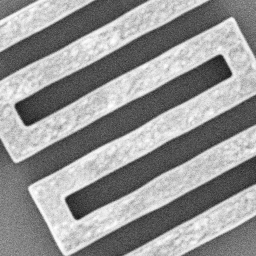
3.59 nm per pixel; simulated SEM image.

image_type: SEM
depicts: groups of lines, slits or small figures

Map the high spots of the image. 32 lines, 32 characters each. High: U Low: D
DDDDUUUUUUUDDDDDDDUUUUUUUDDDDDDD
DDUUUUUUUDDDDDDDUUUUUUUDDDDDDDDD
UUUUUUUDDDDDDDDUUUUUUDDDDDDDUDDD
UUUUUDDDDDDDDUUUUUUDDDDDDDDUUUDD
UUUDDDDDDDDUUUUUUDDDDDDDDUUUUUDD
UUDDDDDDDUUUUUUUDDDDDDDUUUUUUUUD
DDDDDDDUUUUUUUDDDDDDDUUUUUUUUUUD
DDDDDUUUUUUUDDDDDDDUUUUUUUDDUUUU
DDDUUUUUUUDDDDDDDUUUUUUUDDDDDUUU
DUUUUUUUDDDDDDDUUUUUUUDDDDDDDUUU
UUUUUUDDDDDDDUUUUUUUDDDDDDDUUUUU
UUUUDDDDDDDDUUUUUUUDDDDDDDUUUUUU
UUUDDDDDDDUUUUUUDDDDDDDDUUUUUUDD
UUDDDDDDUUUUUUUDDDDDDDUUUUUUUDDD
UUDDDDUUUUUUUDDDDDDDUUUUUUUDDDDD
UUUDUUUUUUUDDDDDDDUUUUUUUDDDDDDD
UUUUUUUUUDDDDDDDDUUUUUUDDDDDDDUU
UUUUUUUDDDDDDDDUUUUUUDDDDDDDDUUU
DUUUUDDDDDDDDUUUUUUDDDDDDDDUUUUU
DUUUDDDDDDDUUUUUUUDDDDDDDUUUUUUU
DDDDDDDDDUUUUUUUDDDDDDDUUUUUUUDD
DDDDDDDUUUUUUUDDDDDDDUUUUUUUDDDD
DDDDDUUUUUUUDDDDDDDUUUUUUUDDDDDD
DDDDUUUUUUDDDDDDDDUUUUUUDDDDDDDU
DDDDUUUUDDDDDDDDUUUUUUDDDDDDDUUU
DDDDDUUUDDDDDDUUUUUUUDDDDDDDUUUU
DDDDDUUUUDDDUUUUUUDDDDDDDDUUUUUU
DDDDDDUUUDUUUUUUUDDDDDDDUUUUUUUD
DDDDDDUUUUUUUUUDDDDDDDUUUUUUUDDD
DDDDDDDUUUUUUDDDDDDDUUUUUUUDDDDD
DDDDDDDUUUUDDDDDDDUUUUUUUDDDDDDD
DDDDDDDDUDDDDDDDDUUUUUUDDDDDDDDD